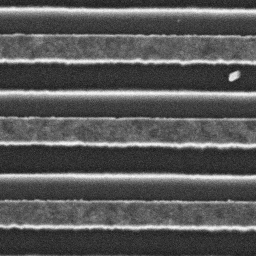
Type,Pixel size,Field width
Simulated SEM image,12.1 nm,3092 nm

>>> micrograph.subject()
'lines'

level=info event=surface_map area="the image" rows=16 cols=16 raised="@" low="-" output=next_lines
----------------
@@@@@@@@@@@@@@@@
@@@@@@@@@@@@@@@@
@@@@@@@@@@@@@@@@
----------------
----------------
@@@@@@@@@@@@@@@@
@@@@@@@@@@@@@@@@
@@@@@@@@@@@@@@@@
----------------
----------------
@@@@@@@@@@@@@@@@
@@@@@@@@@@@@@@@@
@@@@@@@@@@@@@@@@
----------------
----------------